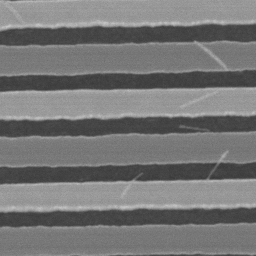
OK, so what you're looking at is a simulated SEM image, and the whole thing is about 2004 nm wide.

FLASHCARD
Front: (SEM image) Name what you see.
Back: lines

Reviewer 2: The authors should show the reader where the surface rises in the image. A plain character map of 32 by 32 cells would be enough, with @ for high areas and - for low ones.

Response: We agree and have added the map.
@@@@@@@@@@@@@@@@@@@@@@@@@@@@@@@@
@@@@@@@@@@@@@@@@@@@@@@@@@@@@@@@@
@@@@@@@@@@@@@@@@@@@@@@@@@@@@@@@@
@@------------------------------
--------------------------------
---------------@@@@@@@@@@@@@@@@@
@@@@@@@@@@@@@@@@@@@@@@@@@@@@@@@@
@@@@@@@@@@@@@@@@@@@@@@@@@@@@@@@@
@@@@@@@@@@@@@@@@@@@@@@@@@@@@@@@@
@@------------------------------
--------------------------------
@@@@@@@@@@@@@@@@@@@@@@@@@@@@@@@@
@@@@@@@@@@@@@@@@@@@@@@@@@@@@@@@@
@@@@@@@@@@@@@@@@@@@@@@@@@@@@@@@@
@@@@@@@@@@@@@@@@@@@@@@@@@-------
--------------------------------
-------------------------------@
@@@@@@@@@@@@@@@@@@@@@@@@@@@@@@@@
@@@@@@@@@@@@@@@@@@@@@@@@@@@@@@@@
@@@@@@@@@@@@@@@@@@@@@@@@@@@@@@@@
@@@@@@@@@@@@@@@@@@@@@-----------
--------------------------------
-------------------------@@-@@@@
@@@@@@@@@@@@@@@@@@@@@@@@@@@@@@@@
@@@@@@@@@@@@@@@@@@@@@@@@@@@@@@@@
@@@@@@@@@@@@@@@@@@@@@@@@@@@@@@@@
--------------------------------
--------------------------------
@@@@@@@@@@@@@@@@@@@@@@@@@@@@@@@@
@@@@@@@@@@@@@@@@@@@@@@@@@@@@@@@@
@@@@@@@@@@@@@@@@@@@@@@@@@@@@@@@@
@@@@@@@@@@@@@@@@@@@@@@@@@@@@@@@@